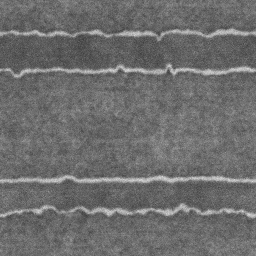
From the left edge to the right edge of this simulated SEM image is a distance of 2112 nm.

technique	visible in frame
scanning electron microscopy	one or a few lines or trenches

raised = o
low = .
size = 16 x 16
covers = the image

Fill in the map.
................
................
oooooooooooooooo
oooooooooooooooo
.o...........o..
................
................
................
................
................
................
oooooooooooooooo
oooooooooooooooo
................
................
................